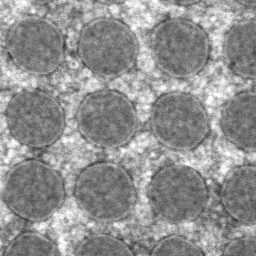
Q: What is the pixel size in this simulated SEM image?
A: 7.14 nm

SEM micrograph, a regular array of raised bodies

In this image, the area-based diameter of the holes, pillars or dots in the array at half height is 406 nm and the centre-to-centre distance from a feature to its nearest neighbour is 513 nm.